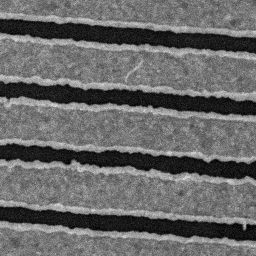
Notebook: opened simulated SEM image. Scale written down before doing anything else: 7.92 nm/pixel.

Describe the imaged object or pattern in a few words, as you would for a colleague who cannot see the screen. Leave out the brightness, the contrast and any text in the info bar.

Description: one or a few lines or trenches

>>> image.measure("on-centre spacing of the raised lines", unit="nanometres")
494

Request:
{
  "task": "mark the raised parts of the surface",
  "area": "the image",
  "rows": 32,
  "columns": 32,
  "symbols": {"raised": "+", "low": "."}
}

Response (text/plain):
++++++++++++++++++++++++++++++++
++++++++++++++++++++++++++++++++
.......+++++++++++++++++++++++++
.....................+++++++++++
+...............................
+++++++++++.....................
++++++++++++++++++++++.+++......
++++++++++++++++++++++++++++++++
++++++++++++++++++++++++++++++++
++++++++++++++++++++++++++++++++
..........++++++++++++++++++++++
......................++++++++++
+...............................
++++++++++++++++................
++++++++++++++++++++++++++++....
++++++++++++++++++++++++++++++++
++++++++++++++++++++++++++++++++
++++++++++++++++++++++++++++++++
.........+++++++++++++++++++++++
.........................+++++++
+++...+..+......................
+++++++++++++++++...............
+++++++++++++++++++++++++++++.+.
++++++++++++++++++++++++++++++++
++++++++++++++++++++++++++++++++
.+++++++++++++++++++++++++++++++
...........+..++++++++++++++++++
...........................+++++
++++++.+........................
+++++++++++++++++++.............
++++++++++++++++++++++++++++++++
++++++++++++++++++++++++++++++++